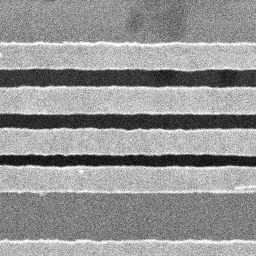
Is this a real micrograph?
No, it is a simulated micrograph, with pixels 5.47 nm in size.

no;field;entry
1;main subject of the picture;lines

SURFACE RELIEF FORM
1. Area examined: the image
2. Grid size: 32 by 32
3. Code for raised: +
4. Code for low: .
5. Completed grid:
................................
................................
................................
................................
................................
++++++++++++++++++..++++++++++++
++++++++++++++++++++++++++++++++
++++++++++++++++++++++++++++++++
++++.+++++++++++++++++++++++++++
................................
................................
++++++++++++++++++++++++++++++++
++++++++++++++++++++++++++++++++
++++++++++++++++++++++++++++++++
................................
................................
++++++++++++++++++++++++++++++++
++++++++++++++++++++++++++++++++
++++++++++++++++++++++++++++++++
...............................+
................................
++++++++++++++++++++++++++++++++
++++++++++++++++++++++++++++++++
++++++++++++++++++++++++++++++++
................................
................................
................................
................................
................................
................................
++++++++++++++++++++++++++++++++
++++++++++++++++++++++++++++++++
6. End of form